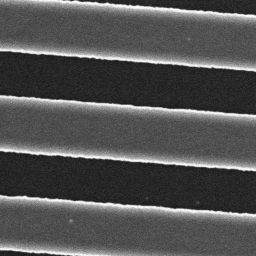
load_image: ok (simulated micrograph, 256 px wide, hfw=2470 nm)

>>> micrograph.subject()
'lines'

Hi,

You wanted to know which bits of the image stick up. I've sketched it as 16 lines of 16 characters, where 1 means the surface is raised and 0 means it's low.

1111111111000000
1111111111111111
1111111111111111
0000011111111111
0000000000000000
0000000000000000
1111111000000000
1111111111111111
1111111111111111
0111111111111111
0000000000000111
0000000000000000
1111000000000000
1111111111111111
1111111111111111
1111111111111111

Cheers